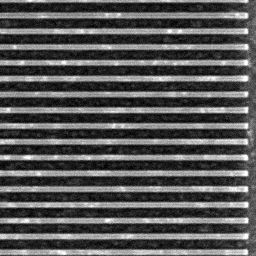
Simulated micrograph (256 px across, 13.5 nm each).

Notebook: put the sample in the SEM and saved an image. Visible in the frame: parallel lines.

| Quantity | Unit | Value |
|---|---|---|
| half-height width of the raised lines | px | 4.88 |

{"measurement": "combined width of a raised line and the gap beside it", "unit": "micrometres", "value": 0.213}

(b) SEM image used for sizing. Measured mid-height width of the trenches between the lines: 158 nm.